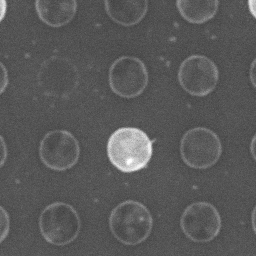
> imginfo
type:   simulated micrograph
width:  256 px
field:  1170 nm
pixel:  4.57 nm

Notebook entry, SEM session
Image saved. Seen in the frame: a regular array of raised bodies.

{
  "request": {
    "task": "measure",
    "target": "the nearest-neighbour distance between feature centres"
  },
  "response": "0.321 um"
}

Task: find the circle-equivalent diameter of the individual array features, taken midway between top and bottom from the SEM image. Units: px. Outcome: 40.1